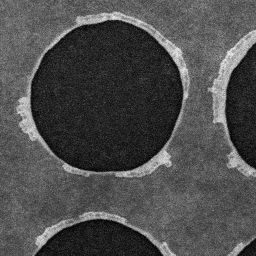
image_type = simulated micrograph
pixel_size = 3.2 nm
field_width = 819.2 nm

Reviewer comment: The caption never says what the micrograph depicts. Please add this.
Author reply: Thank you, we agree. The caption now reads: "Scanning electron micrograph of holes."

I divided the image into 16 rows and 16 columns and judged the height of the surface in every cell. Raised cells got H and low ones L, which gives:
HHHHHHHHHHHHHHHH
HHHHHLLLHHHHHHHH
HHHHLLLLLLHHHHHH
HHHLLLLLLLLHHHHL
HHLLLLLLLLLHHHLL
HHLLLLLLLLLHHHLL
HHLLLLLLLLLHHHLL
HHLLLLLLLLLHHHLL
HHLLLLLLLLLHHHLL
HHHLLLLLLLHHHHHL
HHHHHLLLLHHHHHHH
HHHHHHHHHHHHHHHH
HHHHHHHHHHHHHHHH
HHHHHHHHHHHHHHHH
HHHHLLLLLHHHHHHH
HHHLLLLLLLHHHHHL